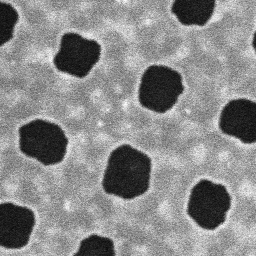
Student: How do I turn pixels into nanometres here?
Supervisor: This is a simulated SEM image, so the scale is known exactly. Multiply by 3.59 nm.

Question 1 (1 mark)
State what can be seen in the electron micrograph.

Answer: holes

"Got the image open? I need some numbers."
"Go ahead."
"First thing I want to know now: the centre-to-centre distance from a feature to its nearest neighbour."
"322 nanometers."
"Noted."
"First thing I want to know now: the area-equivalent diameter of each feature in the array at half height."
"0.169 µm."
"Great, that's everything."